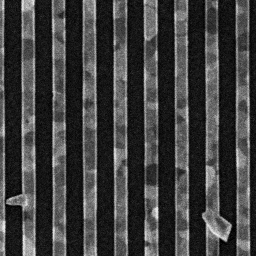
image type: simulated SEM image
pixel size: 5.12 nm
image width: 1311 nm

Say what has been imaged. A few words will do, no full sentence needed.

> parallel lines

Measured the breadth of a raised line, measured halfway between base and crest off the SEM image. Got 0.0589 µm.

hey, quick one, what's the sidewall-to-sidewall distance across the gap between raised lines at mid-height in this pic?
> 94.8 nanometers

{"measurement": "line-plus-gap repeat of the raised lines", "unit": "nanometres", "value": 157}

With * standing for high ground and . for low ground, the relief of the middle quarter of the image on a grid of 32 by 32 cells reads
.....***.....**.....***.....***.
.....***.....**.....***.....***.
.....***.....**.....***.....***.
.....***.....**.....***.....***.
.....***.....**.....***.....***.
.....***.....**.....***.....***.
.....***.....**.....***.....***.
.....***.....**.....***.....***.
.....***.....**.....***.....***.
.....***.....**.....***.....***.
.....***.....**.....***.....***.
.....***.....**.....***.....***.
.....***.....**.....***.....***.
.....***.....**.....***.....***.
.....***.....**.....***.....***.
.....***.....**.....***.....***.
.....***.....**.....***.....***.
.....***.....**.....***.....***.
.....***.....**.....***.....***.
.....***.....**.....***.....***.
.....***.....**.....***.....***.
.....***.....***....***.....***.
.....***.....***....***.....***.
.....***.....***....***.....***.
.....***.....***....***.....***.
.....***.....***....***.....***.
.....***.....***....***.....***.
.....***.....***....***.....***.
.....***.....***....***.....***.
.....***.....***....***.....***.
.....***.....***....***.....***.
.....***.....***....***.....***.